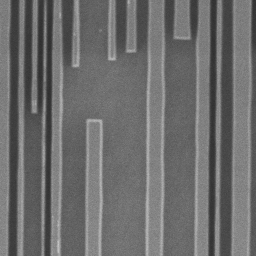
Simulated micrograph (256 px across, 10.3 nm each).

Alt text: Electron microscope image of groups of lines, slits or small figures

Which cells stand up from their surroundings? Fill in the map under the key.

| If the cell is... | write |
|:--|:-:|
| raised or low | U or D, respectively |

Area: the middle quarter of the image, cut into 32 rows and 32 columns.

DDDDDDDDDDDDDDDDDDDDDUUUUDDDDDDD
DDDDDDDDDDDDDDDDDDDDDUUUUDDDDDDD
DDDDDDDDDDDDDDDDDDDDDUUUUDDDDDDD
DDDDDDDDDDDDDDDDDDDDDUUUUDDDDDDD
DDDDDDDDDDDDDDDDDDDDDUUUUDDDDDDD
DDDDDDDDDDDDDDDDDDDDDUUUUDDDDDDD
DDDDDDDDDDDDDDDDDDDDDUUUUDDDDDDD
DDDDDDDDDDDDDDDDDDDDDUUUUDDDDDDD
DDDDDDDDDDDDDDDDDDDDDUUUUDDDDDDD
DDDDDDDDDDDDDDDDDDDDDUUUUDDDDDDD
DDDDDDDDDDDDDDDDDDDDDUUUUDDDDDDD
DDDDDDDDDDDDDDDDDDDDDUUUUDDDDDDD
DDDDDDDDDDDDDDDDDDDDDUUUUDDDDDDD
DDDDDDDDDDDDDDDDDDDDDUUUUDDDDDDD
DDDDDDUUUDDDDDDDDDDDDUUUUDDDDDDD
DDDDDDUUUDDDDDDDDDDDDUUUUDDDDDDD
DDDDDDUUUDDDDDDDDDDDDUUUUDDDDDDD
DDDDDDUUUDDDDDDDDDDDDUUUUDDDDDDD
DDDDDDUUUDDDDDDDDDDDDUUUUDDDDDDD
DDDDDDUUUDDDDDDDDDDDDUUUUDDDDDDD
DDDDDDUUUDDDDDDDDDDDDUUUUDDDDDDD
DDDDDDUUUDDDDDDDDDDDDUUUUDDDDDDD
DDDDDDUUUDDDDDDDDDDDDUUUUDDDDDDD
DDDDDDUUUDDDDDDDDDDDDUUUUDDDDDDD
DDDDDDUUUDDDDDDDDDDDDUUUUDDDDDDD
DDDDDDUUUDDDDDDDDDDDDUUUUDDDDDDD
DDDDDDUUUDDDDDDDDDDDDUUUUDDDDDDD
DDDDDDUUUDDDDDDDDDDDDUUUUDDDDDDD
DDDDDDUUUDDDDDDDDDDDDUUUUDDDDDDD
DDDDDDUUUDDDDDDDDDDDDUUUUDDDDDDD
DDDDDDUUUDDDDDDDDDDDDUUUUDDDDDDD
DDDDDDUUUDDDDDDDDDDDDUUUUDDDDDDD